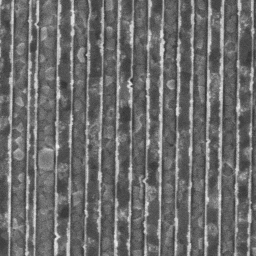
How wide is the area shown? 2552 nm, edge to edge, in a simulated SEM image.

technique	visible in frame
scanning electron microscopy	parallel lines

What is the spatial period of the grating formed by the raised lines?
0.302 um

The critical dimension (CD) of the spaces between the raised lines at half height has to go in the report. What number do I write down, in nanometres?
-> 152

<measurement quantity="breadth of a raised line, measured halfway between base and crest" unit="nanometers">152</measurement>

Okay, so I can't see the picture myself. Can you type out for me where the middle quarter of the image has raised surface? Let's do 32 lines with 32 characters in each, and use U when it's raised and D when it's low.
UUDDDDUUUDDDDDUUUDDDDUUUUDDDUUUU
UUDDDDUUUDDDDDUUUDDDDUUUDDDDDUUU
UUDDDDUUUDDDDDUUUDDDDUUUDDDDDUUU
UUDDDDUUUDDDDUUUUDDDDUUUUDDDUUUU
UUDDDDUUUDDDDUUUUDDDDUUUUDDDUUUU
UUDDDDUUUDDDDUUUUDDDDUUUUDDDUUUU
UUDDDDUUUDDDDUUUUDDDDUUUUDDDUUUU
UUDDDDUUUUDDDUUUUDDDDUUUUDDDUUUU
UUDDDDUUUDDDDUUUUDDDDUUUDDDDUUUU
UUDDDDUUUUDDDUUUUDDDDUUUDDDDUUUU
UUDDDDUUUUDDDUUUUDDDDUUUDDDDUUUU
UUDDDDUUUUDDDUUUUDDDDUUUDDDDUUUU
UUDDDDUUUDDDDUUUUDDDDUUUDDDDUUUU
UUDDDDUUUDDDDUUUUDDDDUUUDDDDUUUU
UUDDDDUUUDDDDUUUUDDDDUUUDDDDUUUU
UUDDDDUUUDDDDUUUUDDDDUUUDDDDUUUU
UUDDDUUUUDDDDUUUUDDDDUUUDDDDUUUU
UUDDDUUUUDDDDUUUUDDDDUUUDDDDUUUU
UUDDDDUUUDDDDUUUUDDDDUUUDDDDUUUU
UUDDDDUUUDDDDUUUUDDDDUUUDDDDUUUU
UUDDDDUUUDDDDUUUUDDDDUUUDDDDUUUU
UUDDDDUUUDDDDUUUUDDDDUUUDDDDUUUU
UUDDDDUUUDDDDUUUUDDDDUUUDDDDUUUU
UUDDDDUUUDDDDUUUUDDDDUUUDDDDUUUU
UUDDDDUUUDDDDUUUUDDDDUUUDDDDUUUU
UDDDDDUUUDDDDUUUUDDDDUUUDDDDUUUU
UDDDDDUUUDDDDUUUUDDDDUUUDDDDUUUU
UDDDDDUUUDDDDUUUUDDDDUUUDDDDUUUU
UDDDDUUUUDDDDUUUUDDDUUUUDDDDUUUU
UDDDDUUUUDDDDUUUUDDDUUUUDDDDUUUU
UDDDDUUUUDDDDUUUUDDDUUUUDDDDUUUU
UDDDDUUUUDDDDUUUUDDDUUUUDDDDUUUU